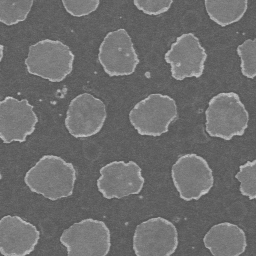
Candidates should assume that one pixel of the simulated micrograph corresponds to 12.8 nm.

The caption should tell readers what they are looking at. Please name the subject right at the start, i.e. a regular array of raised bodies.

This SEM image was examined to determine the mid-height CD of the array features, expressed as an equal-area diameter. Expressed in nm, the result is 529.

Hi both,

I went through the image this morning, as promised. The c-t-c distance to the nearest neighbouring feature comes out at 870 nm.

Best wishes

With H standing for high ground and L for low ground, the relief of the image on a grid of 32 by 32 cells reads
HHHHLLLLHHHHLLLLLHHHHLLLLLHHHHHL
HHHHLLLLLHHLLLLLLLHHLLLLLLHHHHHL
HHHLLLLLLLLLLLLLLLLLLLLLLLLHHHLL
LLLLLLLLLLLLLLLLLLLLLLLLLLLLLLLL
LLLLLLLLLLLLLHHHLLLLLLLHLLLLLLLL
LLLLHHHHLLLLLHHHLLLLLLHHHLLLLLHH
LLLLHHHHHLLLHHHHHLLLLHHHHHLLLLHH
LLLHHHHHHLLLLHHHHLLLLHHHHHLLLLHH
LLLLHHHHHLLLLHHHHLLLLHHHHLLLLLHH
LLLLLHHHLLLLLLLLLLLLLLHHLLLLLLLH
LLLLLLLLLLLLLLLLLLLLLLLLLLLLLLLL
LLLLLLLLLLLLLLLLLLLLLLLLLLLLLLLL
LHLLLLLLLHHHLLLLLLHHHLLLLLHHHHLL
HHHHLLLLLHHHHLLLLHHHHHLLLLHHHHHL
HHHHLLLLHHHHHLLLHHHHHHLLLLHHHHHL
HHHHLLLLHHHHHLLLLHHHHLLLLLHHHHHL
HHHHLLLLLHHHLLLLLHHHHLLLLLHHHHLL
HHHLLLLLLLLLLLLLLLLLLLLLLLLLLLLL
LLLLLLLLLLLLLLLLLLLLLLLLLLLLLLLL
LLLLLLLLLLLLLLLLLLLLLLLHHLLLLLLL
LLLLLHHHHLLLLLHHHLLLLLHHHHLLLLLH
LLLLHHHHHLLLLHHHHHLLLLHHHHLLLLHH
LLLHHHHHHLLLHHHHHHLLLLHHHHHLLLHH
LLLLHHHHHLLLHHHHHHLLLLHHHHLLLLHH
LLLLLLHHLLLLLHHHLLLLLLLHHLLLLLLH
LLLLLLLLLLLLLLLLLLLLLLLLLLLLLLLL
LLLLLLLLLLLLLLLLLLLLLLLLLLLLLLLL
HHHLLLLLLLHHLLLLLLLHLLLLLLLLLLLL
HHHHLLLLLHHHHLLLLHHHHHLLLLHHHHLL
HHHHHLLLHHHHHHLLLHHHHHLLLLHHHHHL
HHHHLLLLHHHHHHLLLHHHHHLLLLHHHHHL
HHHHLLLLHHHHHLLLLHHHHLLLLLHHHHLL